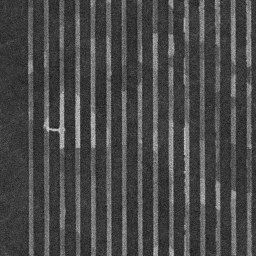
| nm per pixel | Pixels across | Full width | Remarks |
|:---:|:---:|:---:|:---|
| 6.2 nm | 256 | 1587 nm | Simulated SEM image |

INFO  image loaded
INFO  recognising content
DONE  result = parallel lines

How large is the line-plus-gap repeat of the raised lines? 96.5 nanometers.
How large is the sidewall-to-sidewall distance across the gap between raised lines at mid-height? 0.0712 um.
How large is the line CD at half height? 22.5 nm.